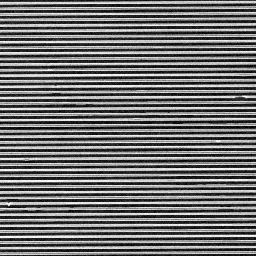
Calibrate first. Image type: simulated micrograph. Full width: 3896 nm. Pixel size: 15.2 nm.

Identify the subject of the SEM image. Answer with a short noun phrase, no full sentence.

parallel lines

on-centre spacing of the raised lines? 84.8 nm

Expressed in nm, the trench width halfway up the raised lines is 53.3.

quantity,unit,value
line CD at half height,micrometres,0.0266